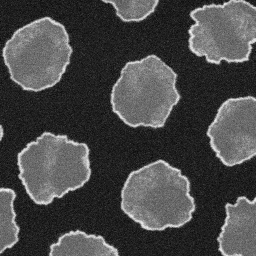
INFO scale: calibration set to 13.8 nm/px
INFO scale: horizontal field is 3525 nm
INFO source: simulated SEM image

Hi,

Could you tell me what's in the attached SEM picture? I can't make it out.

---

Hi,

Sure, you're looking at raised bodies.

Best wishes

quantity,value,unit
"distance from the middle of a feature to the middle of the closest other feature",1.47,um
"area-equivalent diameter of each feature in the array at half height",924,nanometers